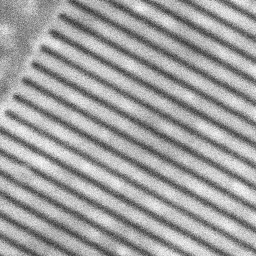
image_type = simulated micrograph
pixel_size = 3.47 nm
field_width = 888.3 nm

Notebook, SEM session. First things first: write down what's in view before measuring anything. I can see parallel lines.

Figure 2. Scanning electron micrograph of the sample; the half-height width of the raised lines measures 36.1 nm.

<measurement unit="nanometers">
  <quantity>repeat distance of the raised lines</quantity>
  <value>64.2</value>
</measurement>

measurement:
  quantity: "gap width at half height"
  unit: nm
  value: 26.2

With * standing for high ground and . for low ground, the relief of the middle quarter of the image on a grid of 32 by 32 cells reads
.....*****....******....*****...
**.....*****....*****.....*****.
****....******....*****.....****
.*****....*****.....*****....***
..******....*****.....*****....*
....*****.....*****....******...
**....*****.....*****....*****..
****....*****....******....*****
******....*****....*****.....***
..*****.....*****....*****.....*
....*****.....****.....*****....
*.....*****....*****.....*****..
***.....*****....*****....******
*****....*****.....*****....****
..*****....*****....*****.....**
...*****.....*****.....****.....
*....*****.....*****....*****...
**.....*****.....*****....*****.
****.....*****....*****.....****
.*****.....*****....*****.....**
...*****....*****.....*****.....
....******....*****.....*****...
**....*****.....*****.....*****.
****....*****.....*****....*****
.*****....*****.....*****....***
...*****....*****....*****.....*
....*****....******....*****....
**....*****....*****.....*****..
***.....*****....*****.....*****
*****....******....*****.....***
..*****.....*****....*****....**
....*****....*****....******....